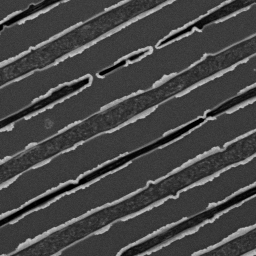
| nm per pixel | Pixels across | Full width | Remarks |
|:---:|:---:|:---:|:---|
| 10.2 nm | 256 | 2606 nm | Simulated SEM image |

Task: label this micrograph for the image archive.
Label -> parallel lines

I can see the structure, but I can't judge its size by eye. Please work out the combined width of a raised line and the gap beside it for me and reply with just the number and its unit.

439 nm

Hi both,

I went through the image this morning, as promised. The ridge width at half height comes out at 314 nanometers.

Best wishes